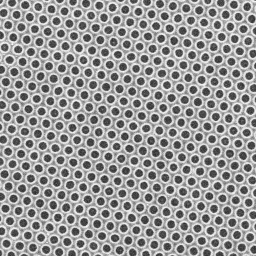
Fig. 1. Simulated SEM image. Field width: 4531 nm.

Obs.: a regular array of holes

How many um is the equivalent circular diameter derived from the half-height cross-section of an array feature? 0.16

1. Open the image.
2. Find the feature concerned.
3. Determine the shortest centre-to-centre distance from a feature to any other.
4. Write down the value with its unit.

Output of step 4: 0.228 µm